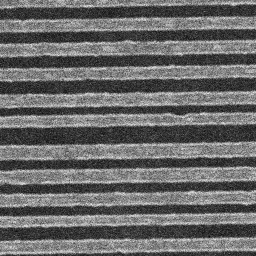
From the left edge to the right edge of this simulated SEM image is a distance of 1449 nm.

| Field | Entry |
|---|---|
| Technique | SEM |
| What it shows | parallel lines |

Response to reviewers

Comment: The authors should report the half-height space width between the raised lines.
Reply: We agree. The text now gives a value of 0.0665 um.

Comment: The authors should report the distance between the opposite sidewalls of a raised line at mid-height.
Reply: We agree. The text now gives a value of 12.6 pixels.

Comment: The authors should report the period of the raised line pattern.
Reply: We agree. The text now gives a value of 139 nm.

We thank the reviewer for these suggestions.